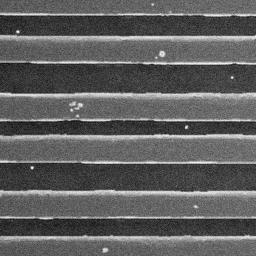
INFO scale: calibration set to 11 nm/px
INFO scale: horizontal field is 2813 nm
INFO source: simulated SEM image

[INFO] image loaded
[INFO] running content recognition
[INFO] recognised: lines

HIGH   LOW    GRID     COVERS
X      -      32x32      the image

XXXXXXXXXXXXXXXXXXXXXXXXXXXXXXXX
XXXXXXXXXXXXXXXXXXXXXXXXXXXXXXXX
--------------------------------
--------------------------------
--------------------------------
XXXXXXXXXXXXXXXXXXXXXXXXXXXXXXXX
XXXXXXXXXXXXXXXXXXXXXXXXXXXXXXXX
XXXXXXXXXXXXXXXXXXXXXXXXXXXXXXXX
--------------------------------
--------------------------------
--------------------------------
--------------------------------
XXXXXXXXXXXXXXXXXXXXXXXXXXXXXXXX
XXXXXXXXXXXXXXXXXXXXXXXXXXXXXXXX
XXXXXXXXXXXXXXXXXXXXXXXXXXXXXXXX
--------------------------------
--------------------------------
XXXXXXXXXXXXXXXXXXXXXXXXXXXXXXXX
XXXXXXXXXXXXXXXXXXXXXXXXXXXXXXXX
XXXXXXXXXXXXXXXXXXXXXXXXXXXXXXXX
--------------------------------
--------------------------------
--------------------------------
--------------------------------
XXXXXXXXXXXXXXXXXXXXXXXXXXXXXXXX
XXXXXXXXXXXXXXXXXXXXXXXXXXXXXXXX
XXXXXXXXXXXXXXXXXXXXXXXXXXXXXXXX
--------------------------------
--------------------------------
--------------------------------
XXXXXXXXXXXXXXXXXXXXXXXXXXXXXXXX
XXXXXXXXXXXXXXXXXXXXXXXXXXXXXXXX